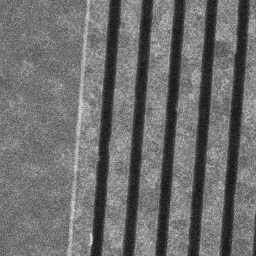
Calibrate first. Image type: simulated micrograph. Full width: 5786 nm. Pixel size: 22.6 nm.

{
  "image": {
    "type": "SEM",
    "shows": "parallel lines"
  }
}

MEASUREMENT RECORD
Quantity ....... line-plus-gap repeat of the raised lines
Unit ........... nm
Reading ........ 728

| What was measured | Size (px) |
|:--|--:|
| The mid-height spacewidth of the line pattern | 10.1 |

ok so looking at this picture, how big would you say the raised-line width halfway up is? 493 nm